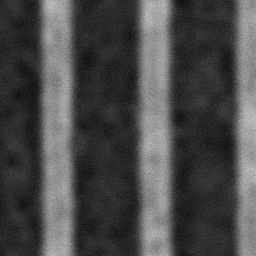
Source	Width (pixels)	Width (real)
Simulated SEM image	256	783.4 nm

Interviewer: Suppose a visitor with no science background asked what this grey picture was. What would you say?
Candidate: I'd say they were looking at one or a few lines or trenches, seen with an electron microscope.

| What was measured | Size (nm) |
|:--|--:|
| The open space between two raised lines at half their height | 230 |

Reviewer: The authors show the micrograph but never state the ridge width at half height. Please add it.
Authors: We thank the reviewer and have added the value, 0.0693 µm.